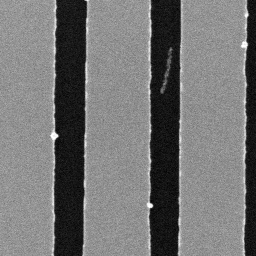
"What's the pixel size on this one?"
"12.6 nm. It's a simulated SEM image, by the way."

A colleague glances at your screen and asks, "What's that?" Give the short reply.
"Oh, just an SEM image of lines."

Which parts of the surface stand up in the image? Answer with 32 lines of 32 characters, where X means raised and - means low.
XXXXXXX----XXXXXXXX----XXXXXXXX-
XXXXXXX----XXXXXXXX----XXXXXXXX-
XXXXXXX----XXXXXXXX----XXXXXXXX-
XXXXXXX----XXXXXXXX----XXXXXXXX-
XXXXXXX----XXXXXXXX----XXXXXXXX-
XXXXXXX----XXXXXXXX----XXXXXXXX-
XXXXXXX----XXXXXXXX----XXXXXXXX-
XXXXXXX----XXXXXXXX----XXXXXXXX-
XXXXXXX----XXXXXXXX----XXXXXXXX-
XXXXXXX----XXXXXXXX----XXXXXXXX-
XXXXXXX----XXXXXXXX----XXXXXXXX-
XXXXXXX----XXXXXXXX----XXXXXXXX-
XXXXXXX----XXXXXXXX----XXXXXXXX-
XXXXXXX----XXXXXXXX----XXXXXXXX-
XXXXXXX----XXXXXXXX----XXXXXXXX-
XXXXXXX----XXXXXXXX---XXXXXXXXX-
XXXXXXX----XXXXXXXX---XXXXXXXXX-
XXXXXXX----XXXXXXXX---XXXXXXXXX-
XXXXXXX----XXXXXXXX---XXXXXXXXX-
XXXXXXX----XXXXXXXX---XXXXXXXXX-
XXXXXXX----XXXXXXXX---XXXXXXXXX-
XXXXXXX----XXXXXXXX---XXXXXXXXX-
XXXXXXX----XXXXXXXX---XXXXXXXXX-
XXXXXXX----XXXXXXXX---XXXXXXXXX-
XXXXXXX----XXXXXXXX---XXXXXXXXX-
XXXXXXX----XXXXXXXX---XXXXXXXXX-
XXXXXXX----XXXXXXXX---XXXXXXXXX-
XXXXXXX----XXXXXXXX---XXXXXXXXX-
XXXXXXX----XXXXXXXX---XXXXXXXX--
XXXXXXX----XXXXXXXX---XXXXXXXX--
XXXXXXX---XXXXXXXXX---XXXXXXXX--
XXXXXXX---XXXXXXXXX---XXXXXXXXX-